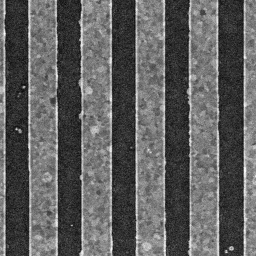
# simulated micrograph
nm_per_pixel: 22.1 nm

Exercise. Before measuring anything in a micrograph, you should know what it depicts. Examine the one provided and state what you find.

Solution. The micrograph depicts lines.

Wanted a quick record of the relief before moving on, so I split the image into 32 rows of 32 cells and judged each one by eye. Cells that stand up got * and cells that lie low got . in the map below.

....***...****...****...***....*
....***...****...****...***....*
....***...****...****...***....*
....***...****...****...***....*
....***...****...****...***....*
....***...****...****...***....*
*...***...****...****...***....*
*...***...****...****...***....*
*...***...****...****...***....*
*...***...****...****...***....*
*...***...****...****...***....*
*...***...****...****...***....*
*...***...****...****...***....*
*...***...****...****...***....*
*...***...****...****...***....*
*...***...****...****...***....*
*...***...****...****...***....*
*...***...****...****...***....*
*...***...****...****...***....*
*...***...****...****...***....*
*...***...****...****...***....*
*...***...****...****...***....*
*...***...****...****...***....*
*...***...****...****...***....*
*...***...****...****...***....*
*...***...****...****...***....*
*...***...****...****...***....*
*...***...****...****...***....*
*...***...****...****...***....*
*...***...****...****...***....*
*...***...****...****...***....*
*...***...****...****...***....*